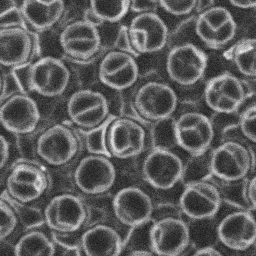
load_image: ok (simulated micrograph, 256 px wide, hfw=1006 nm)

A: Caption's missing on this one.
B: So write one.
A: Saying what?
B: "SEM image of a regular array of raised bodies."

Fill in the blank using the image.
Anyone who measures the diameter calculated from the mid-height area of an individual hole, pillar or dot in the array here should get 141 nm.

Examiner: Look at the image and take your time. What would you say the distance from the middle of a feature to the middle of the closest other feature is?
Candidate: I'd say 188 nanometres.